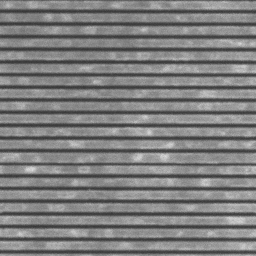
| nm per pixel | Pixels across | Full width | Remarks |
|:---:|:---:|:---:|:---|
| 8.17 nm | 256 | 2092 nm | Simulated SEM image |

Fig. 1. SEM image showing parallel lines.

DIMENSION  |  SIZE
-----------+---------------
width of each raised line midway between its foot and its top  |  72.5 nm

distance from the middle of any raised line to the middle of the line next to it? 0.103 µm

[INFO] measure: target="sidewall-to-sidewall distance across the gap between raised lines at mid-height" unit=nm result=35.8